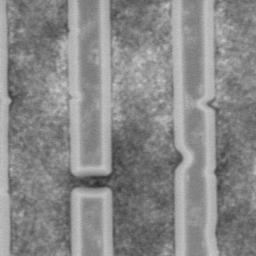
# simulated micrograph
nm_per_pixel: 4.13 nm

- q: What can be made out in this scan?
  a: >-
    one or a few lines or trenches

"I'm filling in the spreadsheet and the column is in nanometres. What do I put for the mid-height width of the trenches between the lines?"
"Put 289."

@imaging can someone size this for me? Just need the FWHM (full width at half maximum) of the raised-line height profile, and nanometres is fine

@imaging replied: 137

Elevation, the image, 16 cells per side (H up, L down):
LLLLLHHLLLLHHLLL
LLLLLHHLLLLHHLLL
LLLLLHHLLLLHHLLL
LLLLLHHLLLLHHLLL
LLLLLHHLLLLHHLLL
LLLLLHHLLLLHHLLL
LLLLLHHLLLLHHLLL
LLLLLHHLLLLHHLLL
LLLLLHHLLLLHHLLL
LLLLLHHLLLLHHLLL
LLLLLHHLLLLHHLLL
LLLLLLLLLLLHHLLL
LLLLLHHLLLLHHLLL
LLLLLHHLLLLHHLLL
LLLLLHHLLLLHHLLL
LLLLLHHLLLLHHLLL